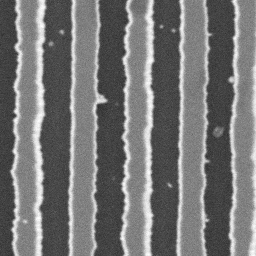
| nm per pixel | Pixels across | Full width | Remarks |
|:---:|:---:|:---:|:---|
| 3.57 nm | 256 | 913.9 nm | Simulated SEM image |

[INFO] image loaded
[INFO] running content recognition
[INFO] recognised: lines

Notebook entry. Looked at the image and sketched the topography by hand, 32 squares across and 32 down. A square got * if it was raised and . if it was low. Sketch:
..****...***....***....***...***
..***....***....***....***...***
..***....***....***....***...***
..***....***....***....***...***
..***....***....***....***...***
..***....***....***...****...***
..***....***....***...****...***
..***....***...****....***...***
..***....***....***....***...***
..***....***....***...****...***
..***....***....***...****...***
..***....***....***....***...***
..***....***....***....***...***
..***....***....***....***...***
..***....***....***...****...***
..***....***....***...****...***
..***....***....***...****...***
..***....***...****...****...***
..***....***....***...****...***
..***....***....***...****...***
..***....***....***...***....***
.****....***....***...****...***
..***....***...****...****...***
..***....***...****...****...***
..***....***....***...***....***
..***....***....***...***....***
..***....***....***...****...***
..***....***...****...***....***
..***....***...****...****...***
..***....***...****...***....***
..***....***...****...****...***
..***....***....***...****...***